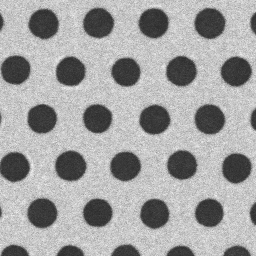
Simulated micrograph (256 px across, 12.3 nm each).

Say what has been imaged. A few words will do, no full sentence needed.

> a regular array of holes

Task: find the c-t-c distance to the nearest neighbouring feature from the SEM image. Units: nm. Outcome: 671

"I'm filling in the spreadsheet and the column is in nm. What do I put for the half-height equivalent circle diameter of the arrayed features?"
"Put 374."